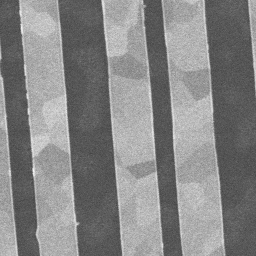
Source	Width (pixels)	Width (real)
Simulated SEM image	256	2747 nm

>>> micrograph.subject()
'one or a few lines or trenches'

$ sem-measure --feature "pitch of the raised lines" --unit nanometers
773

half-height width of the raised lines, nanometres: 423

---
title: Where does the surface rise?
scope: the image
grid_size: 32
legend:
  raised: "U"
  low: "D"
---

DDDUUUUDDDDDDUUUUUDDUUUUUDDDDDDU
DDDUUUUDDDDDDUUUUUDDUUUUUUDDDDDU
DDDUUUUDDDDDDUUUUUDDUUUUUUDDDDDU
DDDUUUUUDDDDDUUUUUDDDUUUUUDDDDDU
DDDUUUUUDDDDDUUUUUDDDUUUUUDDDDDU
DDDUUUUUDDDDDUUUUUDDDUUUUUDDDDDD
DDDUUUUUDDDDDUUUUUDDDUUUUUDDDDDD
DDDUUUUUDDDDDDUUUUDDDUUUUUDDDDDD
DDDUUUUUDDDDDDUUUUUDDUUUUUDDDDDD
DDDUUUUUDDDDDDUUUUUDDUUUUUDDDDDD
DDDUUUUUDDDDDDUUUUUDDUUUUUDDDDDD
DDDUUUUUDDDDDDUUUUUDDUUUUUDDDDDD
UDDUUUUUDDDDDDUUUUUDDUUUUUDDDDDD
UDDDUUUUDDDDDDUUUUUDDUUUUUUDDDDD
UDDDUUUUDDDDDDUUUUUDDDUUUUUDDDDD
UDDDUUUUDDDDDDUUUUUDDDUUUUUDDDDD
UDDDUUUUDDDDDDUUUUUDDDUUUUUDDDDD
UDDDUUUUUDDDDDUUUUUDDDUUUUUDDDDD
UDDDUUUUUDDDDDUUUUUDDDUUUUUDDDDD
UDDDUUUUUDDDDDUUUUUDDDUUUUUDDDDD
UDDDUUUUUDDDDDUUUUUDDDUUUUUDDDDD
UDDDUUUUUDDDDDDUUUUUDDUUUUUDDDDD
UDDDUUUUUDDDDDDUUUUUDDUUUUUDDDDD
UDDDUUUUUDDDDDDUUUUUDDUUUUUDDDDD
UDDDUUUUUDDDDDDUUUUUDDUUUUUDDDDD
UUDDDUUUUDDDDDDUUUUUDDUUUUUUDDDD
UUDDDUUUUDDDDDDUUUUUDDUUUUUUDDDD
UUDDDUUUUDDDDDDUUUUUDDDUUUUUDDDD
UUDDDUUUUUDDDDDUUUUUDDDUUUUUDDDD
UUDDDUUUUUDUDDDUUUUUDDDUUUUUDDDD
UUDDDUUUUUDDDDDUUUUUDDDUUUUUDDDD
UUDDDUUUUUDDDDDUUUUUDDDUUUUUDDDD